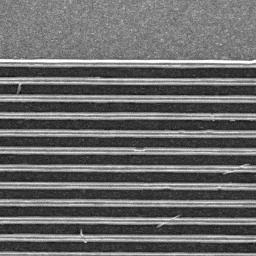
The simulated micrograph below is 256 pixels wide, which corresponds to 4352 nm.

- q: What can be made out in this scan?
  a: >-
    parallel lines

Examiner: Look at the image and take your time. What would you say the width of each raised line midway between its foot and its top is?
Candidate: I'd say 87.1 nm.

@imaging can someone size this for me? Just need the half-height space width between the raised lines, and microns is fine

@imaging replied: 0.204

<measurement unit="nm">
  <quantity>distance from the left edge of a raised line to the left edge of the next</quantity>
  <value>297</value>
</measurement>